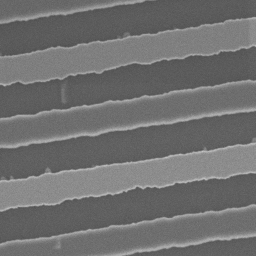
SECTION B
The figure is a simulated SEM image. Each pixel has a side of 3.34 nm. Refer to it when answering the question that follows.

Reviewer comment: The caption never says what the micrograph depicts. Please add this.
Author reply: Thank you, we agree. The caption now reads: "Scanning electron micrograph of lines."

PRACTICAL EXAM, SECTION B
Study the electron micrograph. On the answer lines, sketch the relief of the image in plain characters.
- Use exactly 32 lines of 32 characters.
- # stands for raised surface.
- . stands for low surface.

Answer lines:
################................
##########......................
###.........................####
........................########
................################
..........######################
....########################....
####################............
##############..................
#########.......................
#...........................####
.....................###########
...............#################
.........#######################
..#########################.....
#####################...........
#############...................
########........................
............................####
.....................###########
..............##################
.......#########################
.########################.......
#################...............
############....................
#######.........................
..........................######
...................#############
.............###################
.......#########################
#########################.......
##################..............